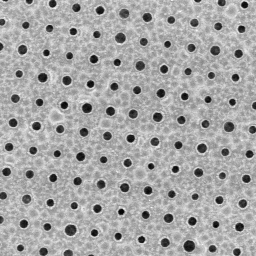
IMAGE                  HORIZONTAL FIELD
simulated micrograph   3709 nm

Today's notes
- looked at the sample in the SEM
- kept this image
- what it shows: a regular array of holes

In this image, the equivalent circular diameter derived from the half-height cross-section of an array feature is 124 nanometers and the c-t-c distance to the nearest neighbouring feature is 343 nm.